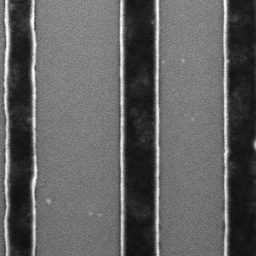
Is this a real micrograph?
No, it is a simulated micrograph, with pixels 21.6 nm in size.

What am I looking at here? one or a few lines or trenches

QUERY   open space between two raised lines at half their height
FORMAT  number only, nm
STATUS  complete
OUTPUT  1670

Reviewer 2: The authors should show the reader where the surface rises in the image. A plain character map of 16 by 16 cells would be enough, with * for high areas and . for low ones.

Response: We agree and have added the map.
**......**....**
**......**....**
**......**....**
**......**....**
**......**....**
**......**....**
**......**....**
**......**....**
**......**....**
**......**....**
**......**....**
**......**....**
**......**....**
**......**....**
**......**....**
**......**....**